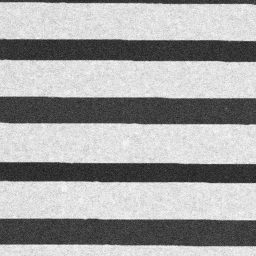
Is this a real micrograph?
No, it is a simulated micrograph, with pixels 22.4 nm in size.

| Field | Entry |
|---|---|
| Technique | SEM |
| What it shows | lines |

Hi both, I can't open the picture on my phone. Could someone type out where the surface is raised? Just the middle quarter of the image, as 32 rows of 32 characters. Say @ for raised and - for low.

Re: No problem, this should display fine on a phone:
@@@@@@@@@@@@@@@@@@@@@@@@@@@@@@@@
@@@@@@@@@@@@@@@@@@@@@@@@@@@@@@@@
@@@@@@@@@@@@@@@@@@@@@@@@@@@@@@@@
@@@@@@@@@@@@@@@@@@@@@@@@@@@@@@@@
@@@@@@@@@@@@@@@@@@@@@@@@@@@@@@@@
@@@@@@@@@@@@@@@@@@@@@@@@@@@@@@@@
@@@@@@@@@@@@@@@@@@@@@@@@@@@@@@@@
@@@@@@@@@@@@@@@@@@@@@@@@@@@@@@@@
--------------------------------
--------------------------------
--------------------------------
--------------------------------
--------------------------------
--------------------------------
--------------------------------
@@@@@@@@@@@@@@@@@@@@@@@@@@@@@@@@
@@@@@@@@@@@@@@@@@@@@@@@@@@@@@@@@
@@@@@@@@@@@@@@@@@@@@@@@@@@@@@@@@
@@@@@@@@@@@@@@@@@@@@@@@@@@@@@@@@
@@@@@@@@@@@@@@@@@@@@@@@@@@@@@@@@
@@@@@@@@@@@@@@@@@@@@@@@@@@@@@@@@
@@@@@@@@@@@@@@@@@@@@@@@@@@@@@@@@
@@@@@@@@@@@@@@@@@@@@@@@@@@@@@@@@
@@@@@@@@@@@@@@@@@@@@@@@@@@@@@@@@
@@@@@@@@@@@@@@@@@@@@@@@@@@@@@@@@
--------------------------------
--------------------------------
--------------------------------
--------------------------------
--------------------------------
@@@@@@@@@@@@@@@@@@@@@@@@@@@@@@@@
@@@@@@@@@@@@@@@@@@@@@@@@@@@@@@@@